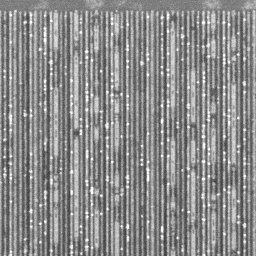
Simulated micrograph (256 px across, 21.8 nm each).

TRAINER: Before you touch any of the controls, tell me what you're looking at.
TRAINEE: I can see parallel lines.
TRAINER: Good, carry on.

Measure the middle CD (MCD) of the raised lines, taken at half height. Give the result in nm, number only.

21.8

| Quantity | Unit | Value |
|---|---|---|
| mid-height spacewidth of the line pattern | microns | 0.0844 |